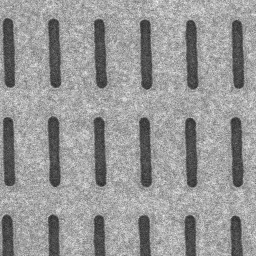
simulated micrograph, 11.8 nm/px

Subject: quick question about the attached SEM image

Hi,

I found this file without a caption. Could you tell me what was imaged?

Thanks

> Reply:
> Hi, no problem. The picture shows a regular array of holes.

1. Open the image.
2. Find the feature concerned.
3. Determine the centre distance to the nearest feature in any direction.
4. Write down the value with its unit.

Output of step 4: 0.54 microns